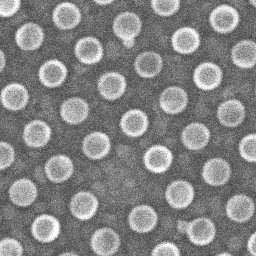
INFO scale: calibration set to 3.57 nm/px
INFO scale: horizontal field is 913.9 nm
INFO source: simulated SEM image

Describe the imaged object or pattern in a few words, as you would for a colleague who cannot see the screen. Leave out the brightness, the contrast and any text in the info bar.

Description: a regular array of raised bodies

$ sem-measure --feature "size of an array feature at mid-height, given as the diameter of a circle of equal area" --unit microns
0.0921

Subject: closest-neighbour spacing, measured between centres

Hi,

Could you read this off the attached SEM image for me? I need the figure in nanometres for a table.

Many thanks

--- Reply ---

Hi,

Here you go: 151